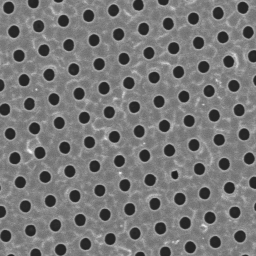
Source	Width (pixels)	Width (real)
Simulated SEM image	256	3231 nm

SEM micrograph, a regular array of holes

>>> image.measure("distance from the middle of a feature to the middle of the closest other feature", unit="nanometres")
311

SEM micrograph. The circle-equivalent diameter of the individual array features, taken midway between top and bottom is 149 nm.